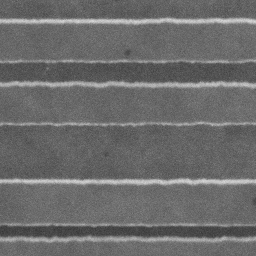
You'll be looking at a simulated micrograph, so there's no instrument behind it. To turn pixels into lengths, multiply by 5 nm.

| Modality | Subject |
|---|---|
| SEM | lines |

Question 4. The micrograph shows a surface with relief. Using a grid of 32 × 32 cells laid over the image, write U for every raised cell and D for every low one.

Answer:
DDDDDDDDDDDDDDDDDDDDDDDDDDDDDDDD
DDDDDDDDDDDDDDDDDDDDDDDDDDDDDDDD
DDDDDDDDDDDDDDDDDDDDUUDDDDUUDDUD
UUUUUUUUUUUUUUUUUUUUUUUUUUUUUUUU
UUUUUUUUUUUUUUUUUUUUUUUUUUUUUUUU
UUUUUUUUUUUUUUUUUUUUUUUUUUUUUUUU
UUUUUUUUUUUUUUUUUUUUUUUUUUUUUUUU
UUUUUUUUUUUUUUUUUUUUUUUUUUUUUUUU
DDDDDDDDDDDDDDDDDDDDDDDDDDDDDDDD
DDDDDDDDDDDDDDDDDDDDDDDDDDDDDDDD
UUUUUUUUUUUUDUUUDUDDDUDDDUUUUUUD
UUUUUUUUUUUUUUUUUUUUUUUUUUUUUUUU
UUUUUUUUUUUUUUUUUUUUUUUUUUUUUUUU
UUUUUUUUUUUUUUUUUUUUUUUUUUUUUUUU
UUUUUUUUUUUUUUUUUUUUUUUUUUUUUUUU
UUUUUUUUUUUUUUUUUUDDUUUUUDUUUUUU
DDDDDDDDDDDDDDDDDDDDDDDDDDDDDDDD
DDDDDDDDDDDDDDDDDDDDDDDDDDDDDDDD
DDDDDDDDDDDDDDDDDDDDDDDDDDDDDDDD
DDDDDDDDDDDDDDDDDDDDDDDDDDDDDDDD
DDDDDDDDDDDDDDDDDDDDDDDDDDDDDDDD
DDDDDDDDDDDDDDDDDDDDDDDDDDDDDDDD
DDDDDDDDDDDDDDDDDDDDDDDDDDDDDDDD
UUUUUUUUUUUUUUUUUUUUUUUUUUUUUUUU
UUUUUUUUUUUUUUUUUUUUUUUUUUUUUUUU
UUUUUUUUUUUUUUUUUUUUUUUUUUUUUUUU
UUUUUUUUUUUUUUUUUUUUUUUUUUUUUUUU
UUUUUUUUUUUUUUUUUUUUUUUUUUUUUUUU
DDDDDDDDDDDDDDDDDDDDDDDDDDDDDDDD
DDDDDDDDDDDDDDDDDDDDDDDDDDDDDDDD
UUUUUUUUUUUUUUUUUUUUUUUUUUUUUUUU
UUUUUUUUUUUUUUUUUUUUUUUUUUUUUUUU